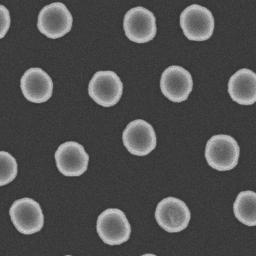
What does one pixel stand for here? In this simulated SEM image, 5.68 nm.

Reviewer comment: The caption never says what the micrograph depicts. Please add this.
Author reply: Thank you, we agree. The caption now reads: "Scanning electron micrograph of a regular array of raised bodies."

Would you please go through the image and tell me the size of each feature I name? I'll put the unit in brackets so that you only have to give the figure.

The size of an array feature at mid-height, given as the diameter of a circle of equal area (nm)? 185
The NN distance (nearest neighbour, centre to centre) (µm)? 0.353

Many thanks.